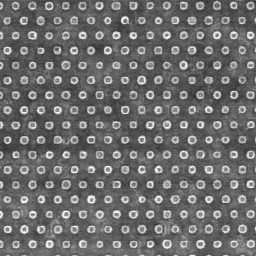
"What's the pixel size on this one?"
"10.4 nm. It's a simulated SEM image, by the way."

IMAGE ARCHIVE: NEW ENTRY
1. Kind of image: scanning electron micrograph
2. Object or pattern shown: a regular array of raised bodies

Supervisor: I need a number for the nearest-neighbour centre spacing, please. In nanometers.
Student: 173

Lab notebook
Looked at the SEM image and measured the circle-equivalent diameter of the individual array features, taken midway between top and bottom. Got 0.0769 micrometres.